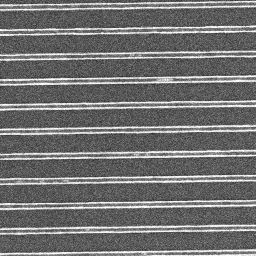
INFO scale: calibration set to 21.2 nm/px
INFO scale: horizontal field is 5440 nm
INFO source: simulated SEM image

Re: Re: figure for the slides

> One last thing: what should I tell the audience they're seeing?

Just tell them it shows parallel lines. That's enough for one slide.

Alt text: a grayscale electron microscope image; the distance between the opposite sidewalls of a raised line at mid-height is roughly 104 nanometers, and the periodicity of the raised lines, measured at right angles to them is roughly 528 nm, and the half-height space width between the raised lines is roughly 430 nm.